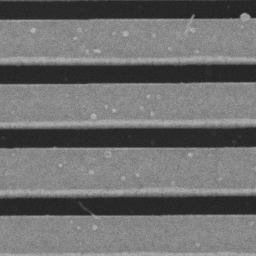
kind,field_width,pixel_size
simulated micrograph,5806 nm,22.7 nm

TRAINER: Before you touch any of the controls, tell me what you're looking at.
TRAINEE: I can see lines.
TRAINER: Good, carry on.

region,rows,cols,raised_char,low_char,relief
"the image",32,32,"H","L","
LLLLLLLLLLLLLLLLLLLLLLLLLLLLLLLL
LLLLLLLLLLLLLLLLLLLLLLLLLLLLLLLL
LLLLLLLLLLLHHHHHHHHHHHHHHHHHHHHH
HHHHHHHHHHHHHHHHHHHHHHHHHHHHHHHH
HHHHHHHHHHHHHHHHHHHHHHHHHHHHHHHH
HHHHHHHHHHHHHHHHHHHHHHHHHHHHHHHH
HHHHHHHHHHHHHHHHHHHHHHHHHHHHHHHH
HHHHHHHHHHHHHHHHHHHHHHHHHHHHHHHH
LLLLLLLLLLLLLLLLLLLLLLLLLLLLLLLL
LLLLLLLLLLLLLLLLLLLLLLLLLLLLLLLL
LLLLLLLLLLLHHHHHHHHHHHHHHHHHHHHH
HHHHHHHHHHHHHHHHHHHHHHHHHHHHHHHH
HHHHHHHHHHHHHHHHHHHHHHHHHHHHHHHH
HHHHHHHHHHHHHHHHHHHHHHHHHHHHHHHH
HHHHHHHHHHHHHHHHHHHHHHHHHHHHHHHH
HHHHHHHHHHHHHHHHHHHHHHHHHHHHHHHH
LLLLLLLLLLLLLLLLLLLLLLLLLLLLLLLL
LLLLLLLLLLLLLLLLLLLLLLLLLLLLLLLL
LLLLLLHLLLLLLLLLLLLLLLLLLLLLHHHH
HHHHHHHHHHHHHHHHHHHHHHHHHHHHHHHH
HHHHHHHHHHHHHHHHHHHHHHHHHHHHHHHH
HHHHHHHHHHHHHHHHHHHHHHHHHHHHHHHH
HHHHHHHHHHHHHHHHHHHHHHHHHHHHHHHH
HHHHHHHHHHHHHHHHHHHHHHHHHHHHHHHH
HHHHLLHLLLLLLLLLLLLLLLLLLLLLLLLL
LLLLLLLLLLLLLLLLLLLLLLLLLLLLLLLL
LLLLLLLLLLLLLLLLLLLLLLLLLLLLLLLL
HHHHHHHHHHHHHHHHHHHHHHHHHHHHHHHH
HHHHHHHHHHHHHHHHHHHHHHHHHHHHHHHH
HHHHHHHHHHHHHHHHHHHHHHHHHHHHHHHH
HHHHHHHHHHHHHHHHHHHHHHHHHHHHHHHH
HHHHHHHHHHHHHHHHHHHHHHHHHHHHHHHH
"